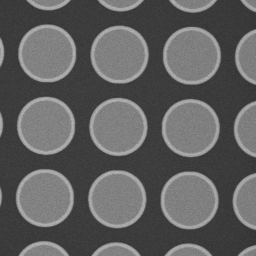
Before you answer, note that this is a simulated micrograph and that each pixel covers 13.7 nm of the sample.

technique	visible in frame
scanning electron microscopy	an array of small figures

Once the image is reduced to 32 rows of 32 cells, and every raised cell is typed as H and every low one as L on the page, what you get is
LLLLHHHHLLLLLHHHHLLLLLHHHHHLLLHH
LLLLLLLLLLLLLLLLLLLLLLLHHLLLLLLL
LLLLLLLLLLLLLLLLLLLLLLLLLLLLLLLL
LLLLHHHHLLLLLLHHLLLLLLLHHLLLLLLL
LLLHHHHHHLLLHHHHHHLLLHHHHHHLLLLH
LLHHHHHHHLLLHHHHHHLLLHHHHHHLLLHH
LLHHHHHHHLLHHHHHHHHLHHHHHHHHLHHH
LLHHHHHHHLLHHHHHHHLLHHHHHHHHLHHH
LLLHHHHHHLLLHHHHHHLLLHHHHHHLLLHH
LLLLHHHHLLLLLHHHHLLLLHHHHHHLLLHH
LLLLLLLLLLLLLLLLLLLLLLLHHLLLLLLL
LLLLLLLLLLLLLLLLLLLLLLLLLLLLLLLL
LLLLHHHLLLLLLHHHLLLLLLLHLLLLLLLL
LLLHHHHHHLLLHHHHHHLLLHHHHHLLLLHH
LLHHHHHHHLLHHHHHHHLLLHHHHHHLLLHH
LLHHHHHHHLLHHHHHHHLLHHHHHHHLLHHH
LLHHHHHHHLLHHHHHHHLLHHHHHHHLLHHH
LLLHHHHHHLLLHHHHHHLLLHHHHHHLLLHH
LLLHHHHHLLLLHHHHHLLLLHHHHHLLLLHH
LLLLLLLLLLLLLLLLLLLLLLLHHLLLLLLH
LLLLLLLLLLLLLLLLLLLLLLLLLLLLLLLL
LLLLHHHLLLLLLHHHLLLLLLLLLLLLLLLL
LLLHHHHHLLLLHHHHHLLLLHHHHHLLLLHH
LLHHHHHHHLLHHHHHHHLLHHHHHHHLLLHH
LLHHHHHHHLLHHHHHHHLLHHHHHHHLLHHH
LLHHHHHHHLLHHHHHHHLLHHHHHHHLLHHH
LLHHHHHHHLLHHHHHHHLLHHHHHHHLLHHH
LLLHHHHHLLLLHHHHHLLLLHHHHHLLLLHH
LLLLLLLLLLLLLLLLLLLLLLLHHLLLLLLH
LLLLLLLLLLLLLLLLLLLLLLLLLLLLLLLL
LLLLHHHLLLLLLHHHLLLLLLLLLLLLLLLL
LLLHHHHHLLLLHHHHHLLLLHHHHHLLLLHH